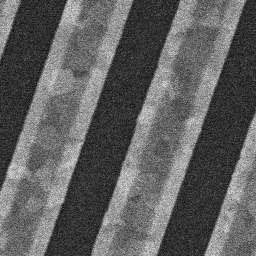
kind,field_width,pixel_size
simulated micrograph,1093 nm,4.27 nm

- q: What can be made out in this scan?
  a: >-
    one or a few lines or trenches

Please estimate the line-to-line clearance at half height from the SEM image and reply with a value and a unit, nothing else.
244 nanometres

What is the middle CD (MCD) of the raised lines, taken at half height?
0.211 um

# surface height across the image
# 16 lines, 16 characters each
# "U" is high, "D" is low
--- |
UDDDUUUUDDDDUUUD
DDDDUUUDDDDUUUDD
DDDDUUUDDDDUUUDD
DDDUUUUDDDUUUUDD
DDDUUUDDDDUUUDDD
DDDUUUDDDDUUUDDD
DDUUUUDDDUUUUDDD
DDUUUDDDDUUUDDDD
DDUUUDDDDUUUDDDD
DUUUUDDDUUUUDDDU
DUUUDDDDUUUDDDDU
DUUUDDDDUUUDDDDU
UUUUDDDUUUUDDDUU
UUUDDDDUUUDDDDUU
UUUDDDDUUUDDDDUU
UUDDDDUUUUDDDUUU